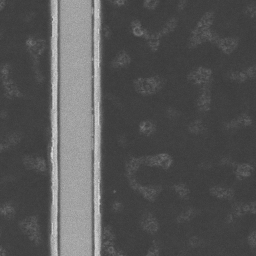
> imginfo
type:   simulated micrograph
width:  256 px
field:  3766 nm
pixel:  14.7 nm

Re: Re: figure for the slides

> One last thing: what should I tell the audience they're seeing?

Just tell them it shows one or a few lines or trenches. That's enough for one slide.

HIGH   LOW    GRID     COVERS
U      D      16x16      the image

UUUDDDUUUUUUUUUU
UUUDDDUUUUUUUUUU
UUUDDDUUUUUUUUUU
UUUDDDUUUUUUUUUU
UUUDDDUUUUUUUUUU
UUUDDDUUUUUUUUUU
UUUDDDUUUUUUUUUU
UUUDDDUUUUUUUUUU
UUUDDDUUUUUUUUUU
UUUDDDUUUUUUUUUU
UUUDDDUUUUUUUUUU
UUUDDDUUUUUUUUUU
UUUDDDUUUUUUUUUU
UUUDDDUUUUUUUUUU
UUUDDDUUUUUUUUUU
UUUDDDUUUUUUUUUU